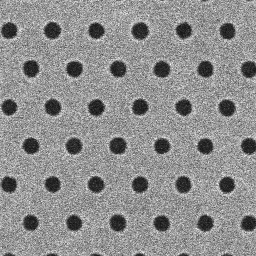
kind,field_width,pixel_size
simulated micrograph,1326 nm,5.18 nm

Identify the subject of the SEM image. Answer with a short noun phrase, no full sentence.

a regular array of holes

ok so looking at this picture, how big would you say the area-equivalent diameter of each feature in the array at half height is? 88.8 nm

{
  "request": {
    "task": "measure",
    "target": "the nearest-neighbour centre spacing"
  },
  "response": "225 nm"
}